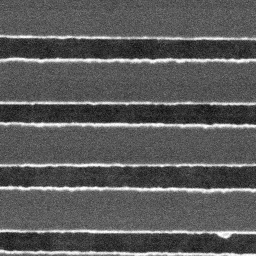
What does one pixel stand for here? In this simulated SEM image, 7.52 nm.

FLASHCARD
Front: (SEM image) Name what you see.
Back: lines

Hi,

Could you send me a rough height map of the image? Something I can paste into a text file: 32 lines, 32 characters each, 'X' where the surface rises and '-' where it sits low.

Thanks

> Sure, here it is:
XXXXXXXXXXXXXXXXXXXXXXXXXXXXXXXX
XXXXXXXXXXXXXXXXXXXXXXXXXXXXXXXX
XXXXXXXXXXXXXXXXXXXXXXXXXXXXXXXX
XXXXXXXXXXXXXXXXXXXXXXXXXXXXXXXX
XXXXXXXXXXXXXXXXXXXXXXXXXXXXXXXX
--------------------------------
--------------------------------
XXXXXXXXXXXXXXXXXXXXXXXXXXXXXXXX
XXXXXXXXXXXXXXXXXXXXXXXXXXXXXXXX
XXXXXXXXXXXXXXXXXXXXXXXXXXXXXXXX
XXXXXXXXXXXXXXXXXXXXXXXXXXXXXXXX
XXXXXXXXXXXXXXXXXXXXXXXXXXXXXXXX
XXXXXXXXXXXXXXXXXXXXXXXXXXXXXXXX
--------------------------------
--------------------------------
XXXXXXXXXXXXXXXX-XXXX-----------
XXXXXXXXXXXXXXXXXXXXXXXXXXXXXXXX
XXXXXXXXXXXXXXXXXXXXXXXXXXXXXXXX
XXXXXXXXXXXXXXXXXXXXXXXXXXXXXXXX
XXXXXXXXXXXXXXXXXXXXXXXXXXXXXXXX
XXXXXXXXXXXXXXXXXXXXXXXXXXXXXXXX
--------------------------------
--------------------------------
XXXXXXX-X-XXXX-X----------------
XXXXXXXXXXXXXXXXXXXXXXXXXXXXXXXX
XXXXXXXXXXXXXXXXXXXXXXXXXXXXXXXX
XXXXXXXXXXXXXXXXXXXXXXXXXXXXXXXX
XXXXXXXXXXXXXXXXXXXXXXXXXXXXXXXX
XXXXXXXXXXXXXXXXXXXXXXXXXXXXXXXX
--------------------------------
--------------------------------
XXXXXXXXXX-X--------------------